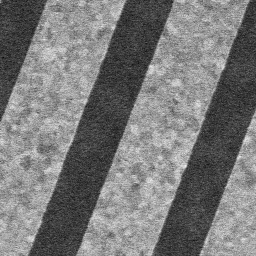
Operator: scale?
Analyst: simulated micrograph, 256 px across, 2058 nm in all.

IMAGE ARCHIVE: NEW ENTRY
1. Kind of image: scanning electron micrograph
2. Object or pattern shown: one or a few lines or trenches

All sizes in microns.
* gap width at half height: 0.374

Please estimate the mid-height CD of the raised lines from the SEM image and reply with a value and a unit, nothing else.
554 nm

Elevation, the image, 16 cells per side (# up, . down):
...#####...####.
..#####...#####.
..#####...#####.
..####....####..
.#####...#####..
.#####...####...
#####...#####...
#####...#####...
#####...####...#
####...#####...#
####...#####...#
###....####...##
###...#####...##
###...####...###
##...#####...###
##...#####...###